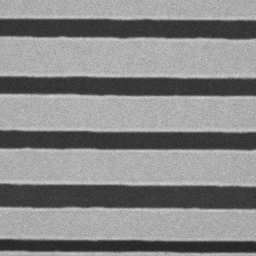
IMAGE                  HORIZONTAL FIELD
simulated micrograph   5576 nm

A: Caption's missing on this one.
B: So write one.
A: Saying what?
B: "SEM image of lines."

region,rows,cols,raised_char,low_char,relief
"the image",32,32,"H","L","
HHHHHHHHHHHHHHHHHHHHHHHHHHHHHHHH
HHHHHHHHHHHHHHHHHHHHHHHHHHHHHHHH
LLLLLLLLLLLLLLLLLLLLLLLLLLLLLLLL
LLLLLLLLLLLLLLLLLLLLLLLLLLLLLLLL
LLLLLLLLLLLLLLLLLLLLLLLLLLLLLLLL
HHHHHHHHHHHHHHHHHHHHHHHHHHHHHHHH
HHHHHHHHHHHHHHHHHHHHHHHHHHHHHHHH
HHHHHHHHHHHHHHHHHHHHHHHHHHHHHHHH
HHHHHHHHHHHHHHHHHHHHHHHHHHHHHHHH
LLLLHHHLLLLLHHHHHHHHHHHHHHHHHHHH
LLLLLLLLLLLLLLLLLLLLLLLLLLLLLLLL
LLLLLLLLLLLLLLLLLLLLLLLLLLLLLLLL
HHHHHHHHHHHHHHHHHHHHHHHHHHHHHHHH
HHHHHHHHHHHHHHHHHHHHHHHHHHHHHHHH
HHHHHHHHHHHHHHHHHHHHHHHHHHHHHHHH
HHHHHHHHHHHHHHHHHHHHHHHHHHHHHHHH
LLLLLLLLLLLLLLLLLLLLLLLLLLLLLLLL
LLLLLLLLLLLLLLLLLLLLLLLLLLLLLLLL
LLLLLLLLLLLLLLLLLLLLLLLLLLLLLLLL
HHHHHHHHHHHHHHHHHHHHHHHHHHHHHHHH
HHHHHHHHHHHHHHHHHHHHHHHHHHHHHHHH
HHHHHHHHHHHHHHHHHHHHHHHHHHHHHHHH
HHHHHHHHHHHHHHHHHHHHHHHHHHHHHHHH
LLLLLLLLLLLLLLLLLLLLLLLLLLLLLLLL
LLLLLLLLLLLLLLLLLLLLLLLLLLLLLLLL
LLLLLLLLLLLLLLLLLLLLLLLLLLLLLLLL
HHHHHHHHHHHHHHHHHHHHHHHHHHHHHHHH
HHHHHHHHHHHHHHHHHHHHHHHHHHHHHHHH
HHHHHHHHHHHHHHHHHHHHHHHHHHHHHHHH
HHHHHHHHHHHHHHHHHHHHHHHHHHHHHHHH
LLLLLLLLLLLLLLLLLLLLLLLLLLLLLLLL
HHHHLLLHLLLLLLLLLLLLLLLLLLLLLLLL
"